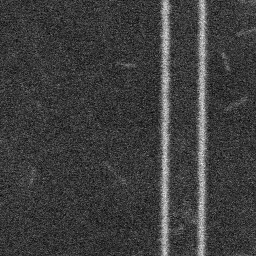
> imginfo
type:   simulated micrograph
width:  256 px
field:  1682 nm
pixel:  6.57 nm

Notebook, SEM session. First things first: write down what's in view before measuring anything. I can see one or a few lines or trenches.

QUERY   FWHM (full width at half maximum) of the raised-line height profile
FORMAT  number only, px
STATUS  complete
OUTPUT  37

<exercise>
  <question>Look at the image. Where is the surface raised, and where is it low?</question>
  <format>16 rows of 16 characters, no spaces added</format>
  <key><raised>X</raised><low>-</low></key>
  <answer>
----------XXX---
----------XXX---
----------XXX---
----------XXX---
----------XXX---
----------XXX---
----------XXX---
----------XXX---
----------XXX---
----------XXX---
----------XXX---
----------XXX---
----------XXX---
----------XXX---
----------XXX---
----------XXX---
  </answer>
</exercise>